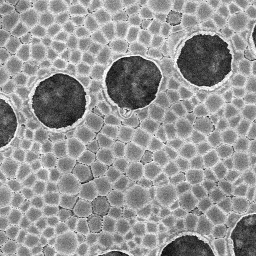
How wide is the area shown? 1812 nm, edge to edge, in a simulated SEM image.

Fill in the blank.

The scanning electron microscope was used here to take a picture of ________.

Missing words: holes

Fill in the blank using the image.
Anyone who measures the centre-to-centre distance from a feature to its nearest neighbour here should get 536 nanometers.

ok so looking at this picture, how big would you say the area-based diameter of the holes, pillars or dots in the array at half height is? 54.3 px